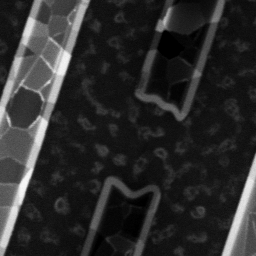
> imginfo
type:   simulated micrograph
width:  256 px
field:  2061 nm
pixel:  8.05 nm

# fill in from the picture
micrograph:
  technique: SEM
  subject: one or a few lines or trenches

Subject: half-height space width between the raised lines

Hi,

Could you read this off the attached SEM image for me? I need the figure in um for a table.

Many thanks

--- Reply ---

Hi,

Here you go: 0.649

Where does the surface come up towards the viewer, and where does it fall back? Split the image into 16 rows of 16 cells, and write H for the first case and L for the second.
LLHHHLLLLLHHHHLL
LLHHHLLLLLHHHLLL
LLHHLLLLLLHHHLLL
LHHHLLLLLHHHHLLL
LHHHLLLLLHHHLLLL
LHHLLLLLLHHHLLLL
HHHLLLLLLLHHLLLL
HHHLLLLLLLLLLLLL
HHLLLLLLLLLLLLLL
HHLLLLLLLLLLLLLL
HHLLLLLLLLLLLLLL
HLLLLLLLLLLLLLLL
HLLLLLHHHHLLLLLH
HLLLLLHHHLLLLLLH
LLLLLLHHHLLLLLLH
LLLLLHHHHLLLLLHH